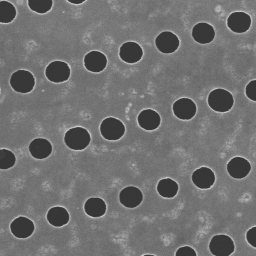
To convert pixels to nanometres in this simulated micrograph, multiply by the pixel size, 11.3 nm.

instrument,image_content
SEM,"a regular array of holes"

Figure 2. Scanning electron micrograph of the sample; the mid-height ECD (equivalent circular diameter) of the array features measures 22.3 px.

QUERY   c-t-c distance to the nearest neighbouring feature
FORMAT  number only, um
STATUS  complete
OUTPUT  0.417